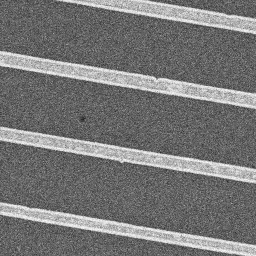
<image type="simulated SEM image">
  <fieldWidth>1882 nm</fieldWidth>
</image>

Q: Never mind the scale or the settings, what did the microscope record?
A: one or a few lines or trenches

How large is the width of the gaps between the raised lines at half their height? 461 nanometers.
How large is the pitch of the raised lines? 544 nm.